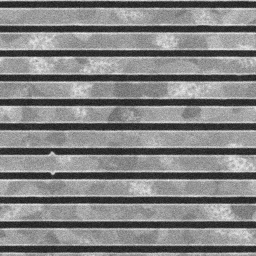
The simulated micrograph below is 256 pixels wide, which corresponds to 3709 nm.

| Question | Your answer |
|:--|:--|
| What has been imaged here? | parallel lines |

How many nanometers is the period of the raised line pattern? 354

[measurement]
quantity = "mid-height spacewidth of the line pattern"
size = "8.5 pixels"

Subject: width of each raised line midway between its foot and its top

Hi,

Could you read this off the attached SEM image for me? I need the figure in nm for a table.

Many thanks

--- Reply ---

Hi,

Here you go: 228